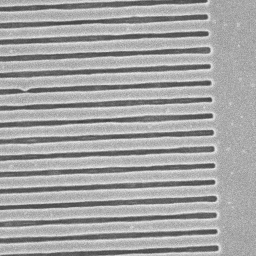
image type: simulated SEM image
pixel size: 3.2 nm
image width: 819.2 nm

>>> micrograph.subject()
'parallel lines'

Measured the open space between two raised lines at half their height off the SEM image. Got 0.0172 microns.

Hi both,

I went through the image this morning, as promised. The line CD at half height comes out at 37.2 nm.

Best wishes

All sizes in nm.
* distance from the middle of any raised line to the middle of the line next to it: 52.9